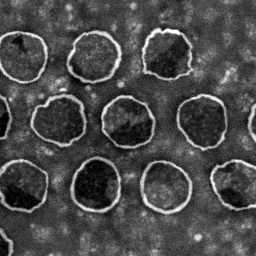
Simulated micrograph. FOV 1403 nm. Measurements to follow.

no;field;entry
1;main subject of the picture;raised bodies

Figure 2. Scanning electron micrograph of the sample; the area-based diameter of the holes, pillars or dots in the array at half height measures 281 nm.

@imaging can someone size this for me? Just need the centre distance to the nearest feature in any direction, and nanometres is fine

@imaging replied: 379